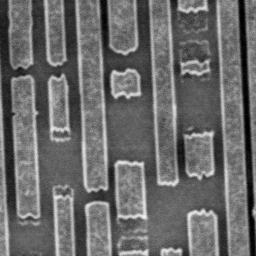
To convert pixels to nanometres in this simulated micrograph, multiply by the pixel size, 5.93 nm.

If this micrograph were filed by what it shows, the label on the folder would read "parallel lines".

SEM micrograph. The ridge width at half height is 123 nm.